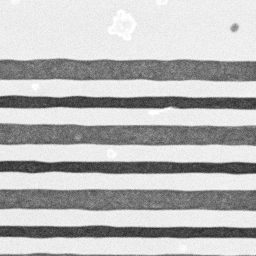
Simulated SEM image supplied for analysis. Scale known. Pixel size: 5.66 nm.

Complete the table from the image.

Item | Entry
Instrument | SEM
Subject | groups of lines, slits or small figures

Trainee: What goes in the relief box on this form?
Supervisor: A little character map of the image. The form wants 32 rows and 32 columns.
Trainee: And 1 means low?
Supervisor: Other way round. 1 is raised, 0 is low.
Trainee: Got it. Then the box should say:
11111111111111111111111111111111
11111111111111111111111111111111
11111111111111111111111111111111
11111111111111111111111111111111
11111111111111111111111111111111
11111111111111111111111111111111
11111111111111111111111111111111
00000000000000000000000000011111
00000000000000000000000000000000
00000000000000000000000000000000
11111111111111111111111111111111
11111111111111111111111111111111
00000000000000000000000000000000
00000001000000000000000000000000
11111111111111111111111111111111
00000000011111111111111111111111
00000000000000000000000000000000
00000000000000000000000000000000
11111111111111111111111111111111
11111111111111111111111111111111
00000000000000000000000000000000
00000000000000000000000000000000
11111111111111111111111111111111
11111111111111111111111111111111
00000000000000000000000000000000
00000000000000000000000000000000
11111111111111111111111111111111
11111111111111111111111111111111
00000000000000000000000000000000
00000000000000000000000000000000
11111111111111111111111111111111
11111111111111111111111111111111